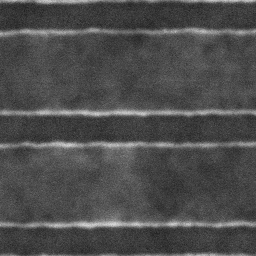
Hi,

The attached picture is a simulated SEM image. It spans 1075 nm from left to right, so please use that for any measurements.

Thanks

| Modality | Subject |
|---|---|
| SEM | lines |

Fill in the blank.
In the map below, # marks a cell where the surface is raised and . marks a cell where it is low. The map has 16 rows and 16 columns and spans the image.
................
................
################
################
################
################
################
................
................
################
################
################
################
################
................
................